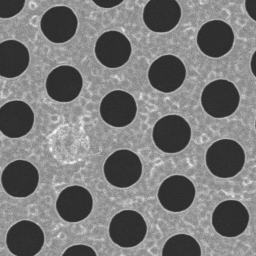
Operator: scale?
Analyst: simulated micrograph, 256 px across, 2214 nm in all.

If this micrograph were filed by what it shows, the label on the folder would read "a regular array of holes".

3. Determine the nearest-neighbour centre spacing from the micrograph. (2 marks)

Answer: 512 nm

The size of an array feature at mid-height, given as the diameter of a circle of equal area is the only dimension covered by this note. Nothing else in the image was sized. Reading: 323 nm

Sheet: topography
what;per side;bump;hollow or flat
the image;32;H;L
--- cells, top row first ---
LLLHHHHHHHHHLLLHHHLLLLHHHHHHHHHL
LLHHHHLLLHHHHHHHHHLLLLLHHHHHHHHL
HHHHHLLLLLHHHHHHHHLLLLHHHHHHHHHH
HHHHHLLLLLHHHHHHHHHLLLHHHLLLLHHH
HHHHHHLLLHHHHLLLHHHHHHHHHLLLLHHH
LLLHHHHHHHHHLLLLHHHHHHHHHLLLLHHH
LLLLHHHHHHHHLLLLHHHHHHHHHLLLHHHH
LLLLHHHHHHHHLLLLHHHLLLLHHHHHHHHL
LLLHHHHLLHHHHHHHHHHLLLLHHHHHHHHL
LLHHHHLLLLHHHHHHHHHLLLLHHHHHHHHH
HHHHHHLLLLHHHHHHHHHLLLLHHHLLLHHH
HHHHHHLLLLHHHHLLHHHHLHHHHLLLLLHH
HHHHHHHLLHHHHLLLLHHHHHHHHLLLLLHH
LLLLHHHHHHHHLLLLLHHHHHHHHLLLLLHH
LLLLHHHHHHHHHLLLLHHHHLHHHHLLLHHH
LLLLHHHHHHHHHHLLHHHLLLLLHHHHHHHH
LLLLHHHHHHHHHHHHHHHLLLLLHHHHHHHH
HHHHHHHHHHHHHHHHHHHLLLLLHHHHLHHH
HHHHHHHHHHHHHHHHHHHHLLLHHHLLLLHH
HHHHHHHHHHHHHHLLLHHHHHHHHHLLLLLH
HLLLHHHHHHHHHLLLLLHHHHHHHHLLLLLH
LLLLLHHHHHHHHLLLLLHHHHHHHHLLLLHH
LLLLLHHHHHHHHLLLLHHHHLLLHHHHHHHH
LLLLLHHHLLLHHHHHHHHHLLLLHHHHHHHH
HLLHHHHLLLLHHHHHHHHHLLLLHHHHHHHH
HHHHHHHLLLLLHHHHHHHHLLLLHHHLLLHH
HHHHHHHLLLLHHHHLLHHHHHHHHHHLLLLH
HHHHHHHHLLHHHHLLLLHHHHHHHHHLLLLH
HLLLLHHHHHHHHHLLLLHHHHHHHHHLLLLH
HLLLLHHHHHHHHHLLLLHHHHLLHHHHLLHH
HLLLLHHHHHHHHHHLLHHHHLLLLHHHHHHH
HLLLLHHHLLLLHHHHHHHHLLLLLHHHHHHH